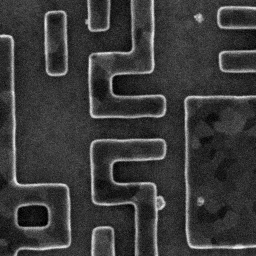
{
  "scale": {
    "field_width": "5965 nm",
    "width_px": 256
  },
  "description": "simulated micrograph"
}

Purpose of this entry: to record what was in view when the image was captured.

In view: wiring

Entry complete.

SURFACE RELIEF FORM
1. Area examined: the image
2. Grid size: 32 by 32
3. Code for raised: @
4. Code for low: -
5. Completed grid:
-----------@@@--@@@-------------
------@@---@@@--@@@--------@@@@@
------@@---@@@---@@--------@@@@@
------@@---@@----@@---------@@@@
@-----@@---------@@-------------
@@----@@---------@@-------------
@@----@@--------@@@---------@@@@
@@----@@---@@@@@@@@---------@@@@
@@----@@---@@@@@@@@---------@@@@
@@---------@@@------------------
@@---------@@@------------------
@@---------@@@------------------
@@---------@@@@@@@@@@--@@@@@@@@@
@@---------@@@@@@@@@@--@@@@@@@@@
@@----------@@@@@@-@---@@@@@@@@@
@@---------------------@@@@@@@@@
@@---------------------@@@@@@@@@
@@----------@@@@@@@@---@@@@@@@@@
@@---------@@@@@@@@@@--@@@@@@@@@
@@---------@@@@@@@@@@--@@@@@@@@@
@@---------@@@---------@@@@@@@@@
@@---------@@@---------@@@@@@@@@
@@----------@@---------@@@@@@@@@
@@@@@@@@----@@@@@@@@---@@@@@@@@@
@@@@@@@@@---@@@@@@@@---@@@@@@@@@
@@@@@@@@@---@@@-@@@@---@@@@@@@@@
@@----@@@--------@@@---@@@@@@@@@
@@----@@@--------@@@---@@@@@@@@@
@@@@@@@@@---@@---@@@---@@@@@@@@@
@@@@@@@@@---@@---@@@---@@@@@@@@@
@@@@@@@@@---@@---@@@----@@@@@@@@
@@----------@@---@@@------------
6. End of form